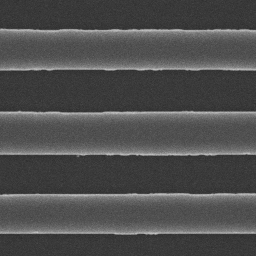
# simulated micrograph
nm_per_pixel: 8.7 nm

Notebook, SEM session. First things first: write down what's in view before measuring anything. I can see lines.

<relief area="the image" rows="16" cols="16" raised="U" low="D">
DDDDDDDDDDDDDDDD
DDDDDDDDDDDDDDDD
UUUUUUUUUUUUUUUU
UUUUUUUUUUUUUUUU
DDDDDDDDDDDDDDDD
DDDDDDDDDDDDDDDD
DDDDDDDDDDDDDDDD
UUUUUUUUUUUUUUUU
UUUUUUUUUUUUUUUU
UUUUUUUUUUUUUUUU
DDDDDDDDDDDDDDDD
DDDDDDDDDDDDDDDD
UUUUUUUUUUUUUUUU
UUUUUUUUUUUUUUUU
UUUUUUUUUUUUUUUU
DDDDDDDDDDDDDDDD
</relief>